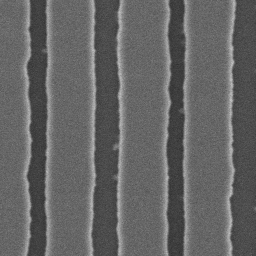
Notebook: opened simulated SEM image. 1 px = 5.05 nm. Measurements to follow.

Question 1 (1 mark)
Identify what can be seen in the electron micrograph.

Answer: lines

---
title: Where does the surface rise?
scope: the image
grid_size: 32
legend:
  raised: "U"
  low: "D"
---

UUUUDDUUUUUUDDDUUUUUUDDUUUUUUDDD
UUUUDDUUUUUUDDDUUUUUUDDUUUUUUDDD
UUUUDDUUUUUUDDDUUUUUUDDUUUUUUDDD
UUUUDDUUUUUUDDDUUUUUUDDUUUUUUDDD
UUUUDDUUUUUUDDDUUUUUUDDUUUUUUDDD
UUUUDDUUUUUUDDDUUUUUUDDUUUUUUDDD
UUUUDDUUUUUUDDDUUUUUUDDUUUUUUDDD
UUUUDDUUUUUUDDDUUUUUUDDUUUUUUDDD
UUUDDDUUUUUUDDDUUUUUUDDUUUUUUDDD
UUUDDDUUUUUUDDDUUUUUUDDUUUUUUDDD
UUUUDDUUUUUUDDDUUUUUUDDUUUUUUDDD
UUUDDDUUUUUUDDDUUUUUUDDUUUUUUDDD
UUUUDDUUUUUUDDDUUUUUUDDUUUUUUDDD
UUUUDDUUUUUUDDDUUUUUUDDUUUUUUDDD
UUUUDDUUUUUUDDDUUUUUUDDUUUUUUDDD
UUUUDDUUUUUUDDDUUUUUUDDUUUUUUDDD
UUUUDDUUUUUUDDDUUUUUUDDUUUUUUDDD
UUUUDDUUUUUUDDDUUUUUUDDUUUUUUDDD
UUUUDDUUUUUUDDDUUUUUUDDUUUUUUDDD
UUUUDDUUUUUUDDDUUUUUUDDUUUUUUDDD
UUUUDDUUUUUUDDDUUUUUUDDUUUUUUDDD
UUUDDDUUUUUUDDDUUUUUUDDUUUUUUDDD
UUUDDDUUUUUUDDDUUUUUUDDUUUUUUDDD
UUUUDDUUUUUUDDDUUUUUUDDUUUUUUDDD
UUUUDDUUUUUUDDDUUUUUUDDUUUUUUDDD
UUUUDDUUUUUUDDDUUUUUUDDUUUUUUDDD
UUUUDDUUUUUUDDDUUUUUUDDUUUUUUDDD
UUUUDDUUUUUUDDDUUUUUUDDUUUUUUDDD
UUUUDDUUUUUDDDDUUUUUUDDUUUUUUDDD
UUUUDDUUUUUDDDDUUUUUUDDUUUUUUDDD
UUUUDDUUUUUDDDDUUUUUUDDUUUUUUDDD
UUUDDDUUUUUUDDDUUUUUUDDUUUUUUDDD